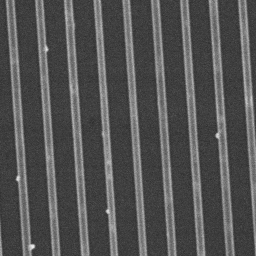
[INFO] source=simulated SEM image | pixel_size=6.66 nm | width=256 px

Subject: parallel lines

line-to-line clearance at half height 146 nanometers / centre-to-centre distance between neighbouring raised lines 0.193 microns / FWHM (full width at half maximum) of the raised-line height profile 0.0481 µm